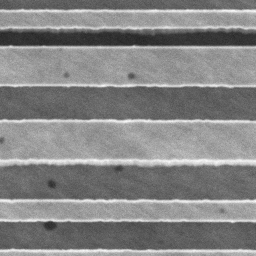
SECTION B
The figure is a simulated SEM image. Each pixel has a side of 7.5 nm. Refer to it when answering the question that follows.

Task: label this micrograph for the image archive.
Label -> lines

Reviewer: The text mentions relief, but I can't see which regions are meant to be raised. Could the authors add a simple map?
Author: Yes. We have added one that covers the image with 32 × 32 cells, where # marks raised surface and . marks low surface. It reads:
................................
################################
################################
################################
................................
................................
################################
################################
################################
################################
################################
................................
................................
................................
................................
################################
################################
################################
################################
################################
................................
................................
................................
................................
................................
################################
################################
################################
................................
................................
................................
################################